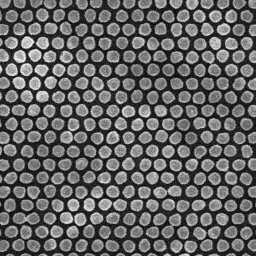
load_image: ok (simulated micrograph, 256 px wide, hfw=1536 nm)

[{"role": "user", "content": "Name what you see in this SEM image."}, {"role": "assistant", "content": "a regular array of raised bodies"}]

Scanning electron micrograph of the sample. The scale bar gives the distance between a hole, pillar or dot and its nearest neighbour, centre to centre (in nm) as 88.6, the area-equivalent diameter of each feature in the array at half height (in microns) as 0.072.